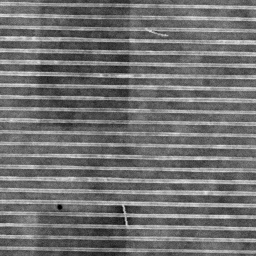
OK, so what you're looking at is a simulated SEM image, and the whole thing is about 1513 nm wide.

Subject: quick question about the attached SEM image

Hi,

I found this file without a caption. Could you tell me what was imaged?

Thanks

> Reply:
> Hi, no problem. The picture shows parallel lines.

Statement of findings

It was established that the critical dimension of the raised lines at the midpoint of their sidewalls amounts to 20.7 nanometers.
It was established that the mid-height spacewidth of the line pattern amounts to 8 px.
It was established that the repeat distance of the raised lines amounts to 68.9 nanometers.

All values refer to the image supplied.